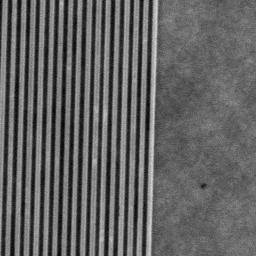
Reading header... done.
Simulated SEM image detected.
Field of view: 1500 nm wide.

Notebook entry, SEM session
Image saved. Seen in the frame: parallel lines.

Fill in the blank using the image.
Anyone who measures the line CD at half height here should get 4.62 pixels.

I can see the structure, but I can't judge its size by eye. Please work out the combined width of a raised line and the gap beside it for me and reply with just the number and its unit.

54.9 nanometers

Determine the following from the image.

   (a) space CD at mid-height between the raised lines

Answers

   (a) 27.1 nm